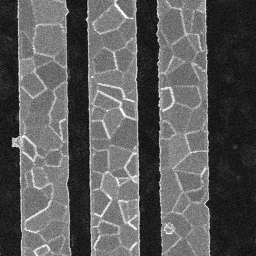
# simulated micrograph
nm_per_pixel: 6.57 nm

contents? one or a few lines or trenches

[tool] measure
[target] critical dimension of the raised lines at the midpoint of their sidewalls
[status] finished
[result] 315 nm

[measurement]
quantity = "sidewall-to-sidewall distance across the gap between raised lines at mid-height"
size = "139 nm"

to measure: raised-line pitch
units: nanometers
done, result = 460